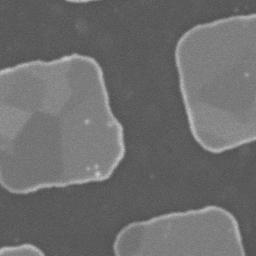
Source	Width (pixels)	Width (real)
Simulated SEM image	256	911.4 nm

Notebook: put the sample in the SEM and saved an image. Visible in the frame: raised bodies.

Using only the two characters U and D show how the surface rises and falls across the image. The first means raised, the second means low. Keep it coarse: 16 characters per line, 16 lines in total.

DDDDDDDDDDDDDDDD
DDDDDDDDDDDDDUUU
DDDDDDDDDDDUUUUU
DDDDDDDDDDDUUUUU
UUUUUUDDDDDUUUUU
UUUUUUUDDDDUUUUU
UUUUUUUDDDDDUUUU
UUUUUUUDDDDDUUUU
UUUUUUUUDDDDUUUU
UUUUUUUUDDDDDDDD
UUUUUUUDDDDDDDDD
UUUUDDDDDDDDDDDD
DDDDDDDDDDDDDDDD
DDDDDDDDDDUUUUDD
DDDDDDDDUUUUUUUD
DUDDDDDUUUUUUUUD